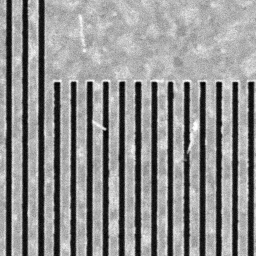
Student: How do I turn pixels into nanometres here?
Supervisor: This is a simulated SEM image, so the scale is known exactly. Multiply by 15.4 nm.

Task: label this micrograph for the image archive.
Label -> parallel lines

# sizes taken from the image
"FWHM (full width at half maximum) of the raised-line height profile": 140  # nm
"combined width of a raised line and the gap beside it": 245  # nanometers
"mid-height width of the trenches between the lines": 0.112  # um